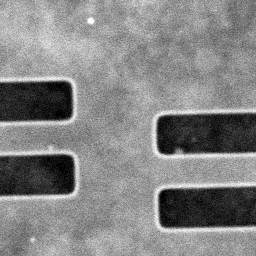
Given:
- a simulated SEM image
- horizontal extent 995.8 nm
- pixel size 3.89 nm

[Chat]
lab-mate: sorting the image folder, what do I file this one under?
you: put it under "groups of lines, slits or small figures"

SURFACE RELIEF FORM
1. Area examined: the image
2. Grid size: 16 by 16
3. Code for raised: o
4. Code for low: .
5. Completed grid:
oooooooooooooooo
oooooooooooooooo
oooooooooooooooo
oooooooooooooooo
oooooooooooooooo
.....ooooooooooo
.....ooooooooooo
....oooooo......
oooooooooo......
oooooooooo......
.....ooooooooooo
.....ooooooooooo
oooooooooo......
oooooooooo......
oooooooooooooooo
oooooooooooooooo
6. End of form